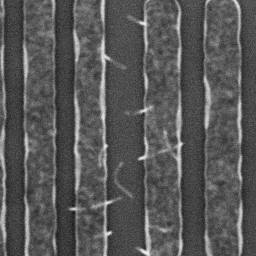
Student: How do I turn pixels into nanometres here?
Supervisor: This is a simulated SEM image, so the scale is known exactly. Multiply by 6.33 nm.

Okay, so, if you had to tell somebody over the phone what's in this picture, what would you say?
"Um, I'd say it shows groups of lines, slits or small figures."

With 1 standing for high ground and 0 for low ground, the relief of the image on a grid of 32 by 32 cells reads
00011110011110000011110000111100
00011110011110000011110000111100
00011110011110000011110000111100
00011110011110000011110000111100
00011110011110000011110000111100
00011110001110000011110000111100
00011110001110000011110000111100
00011110001110000011110000111100
00011110011110000011110000111100
00011110011110000011110000111100
00011110011110000011110000111100
10011110011110000011110000111100
10011110011110000011110000111100
10011110001110000011110000111100
10011110001110000011110000111100
10011110001110000011110000111100
00011110001110000011110000111100
00011110001110000011110000111100
00011110011110000011110000111100
00011110001110000011110000111100
00011110001110000011110000111100
10011110001110000011110000111100
10011110001110000011110000111100
10011110001110000011110000111100
10011110001110000011110000111100
00011110001110000011110000111100
00011110011110000011110000111100
00011110001110000011111000111100
00011110001110000011111000111100
10001110001110000011110000111100
10011110001110000001111000111100
10011110001110000011110000111100